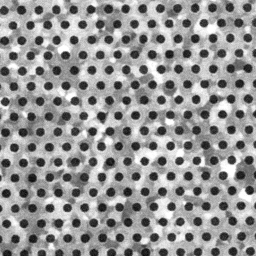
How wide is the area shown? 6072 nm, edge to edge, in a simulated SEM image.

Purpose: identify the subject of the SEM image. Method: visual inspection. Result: a regular array of holes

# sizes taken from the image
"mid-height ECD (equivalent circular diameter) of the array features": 233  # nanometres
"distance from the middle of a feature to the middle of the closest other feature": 408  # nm